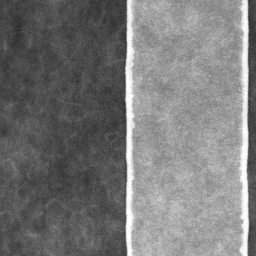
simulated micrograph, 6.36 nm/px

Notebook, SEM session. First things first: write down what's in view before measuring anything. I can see one or a few lines or trenches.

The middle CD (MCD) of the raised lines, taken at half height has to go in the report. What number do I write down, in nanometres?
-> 738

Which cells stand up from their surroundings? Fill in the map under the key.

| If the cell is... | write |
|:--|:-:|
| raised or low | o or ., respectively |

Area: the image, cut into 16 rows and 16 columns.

........ooooooo.
........ooooooo.
........ooooooo.
........ooooooo.
........ooooooo.
........ooooooo.
........ooooooo.
........ooooooo.
........ooooooo.
........ooooooo.
........ooooooo.
........ooooooo.
........ooooooo.
........ooooooo.
........ooooooo.
........ooooooo.